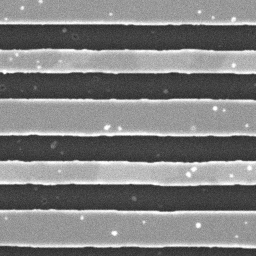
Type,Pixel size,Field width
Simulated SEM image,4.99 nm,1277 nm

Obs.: lines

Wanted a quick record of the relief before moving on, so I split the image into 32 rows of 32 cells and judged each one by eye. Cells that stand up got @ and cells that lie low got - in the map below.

@@@@@@@@@@@@@@@@@@@@@@@@@@@@@@@@
@@@@@@@@@@@@@@@@@@@@@@@@@@@@@@@@
@@@@@@@@@@@@@@@@@@@@@@@@@@@@@@@@
--------------------------------
--------------------------------
--------------------------------
@@@@@@@@@@@@@@@@@@@@@@@@@@@@@@@@
@@@@@@@@@@@@@@@@@@@@@@@@@@@@@@@@
@@@@@@@@@@@@@@@@@@@@@@@@@@@@@@@@
--------------------------------
--------------------------------
--------------------------------
@@@@@@---------------@@@@@@-----
@@@@@@@@@@@@@@@@@@@@@@@@@@@@@@@@
@@@@@@@@@@@@@@@@@@@@@@@@@@@@@@@@
@@@@@@@@@@@@@@@@@@@@@@@@@@@@@@@@
@@@@@@@@@@@@@@@@@@@@@@@@@@@@@@@@
--------------------------------
--------------------------------
--------------------------------
@@@@@@@@@@@@@@@@@@@@@@@@@@@@@@@@
@@@@@@@@@@@@@@@@@@@@@@@@@@@@@@@@
@@@@@@@@@@@@@@@@@@@@@@@@@@@@@@@@
--------------------------------
--------------------------------
--------------------------------
@@@@@@@@@@@@@@@@-@-----@@@@@@@@-
@@@@@@@@@@@@@@@@@@@@@@@@@@@@@@@@
@@@@@@@@@@@@@@@@@@@@@@@@@@@@@@@@
@@@@@@@@@@@@@@@@@@@@@@@@@@@@@@@@
@@@@@@@@@@@@@@@@@@@@@@@@@@@@@@@@
--------------------------------